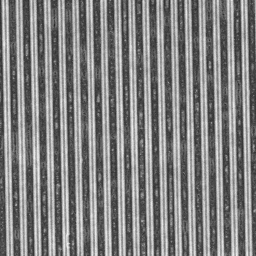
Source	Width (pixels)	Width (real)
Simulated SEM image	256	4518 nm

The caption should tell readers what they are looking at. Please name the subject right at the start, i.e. parallel lines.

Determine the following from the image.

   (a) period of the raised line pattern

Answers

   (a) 14.1 px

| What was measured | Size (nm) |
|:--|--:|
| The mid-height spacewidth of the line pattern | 150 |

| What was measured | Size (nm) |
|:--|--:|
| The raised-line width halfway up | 104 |